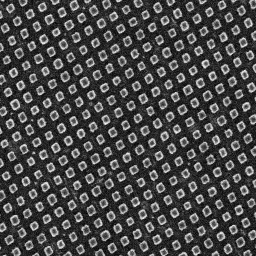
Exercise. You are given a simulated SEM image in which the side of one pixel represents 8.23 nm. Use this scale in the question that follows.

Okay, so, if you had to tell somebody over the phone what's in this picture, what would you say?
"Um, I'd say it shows a regular array of raised bodies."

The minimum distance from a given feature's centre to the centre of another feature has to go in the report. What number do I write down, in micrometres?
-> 0.116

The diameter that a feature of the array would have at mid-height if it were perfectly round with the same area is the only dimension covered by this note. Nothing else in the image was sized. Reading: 0.0664 um